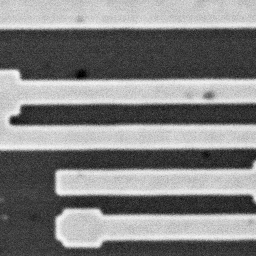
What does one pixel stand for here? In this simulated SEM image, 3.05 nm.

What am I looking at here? wiring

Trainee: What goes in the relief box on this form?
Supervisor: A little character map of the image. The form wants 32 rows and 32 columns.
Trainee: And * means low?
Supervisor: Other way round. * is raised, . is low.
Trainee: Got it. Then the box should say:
********************************
********************************
********************************
................................
................................
................................
................................
................................
................................
**..............................
********************************
********************************
********************************
**..............................
*...............................
*...............................
********************************
********************************
********************............
................................
................................
.......*************************
.......*************************
.......*************************
................................
................................
........****....................
.......*************************
.......*************************
.......*************************
........****....................
................................